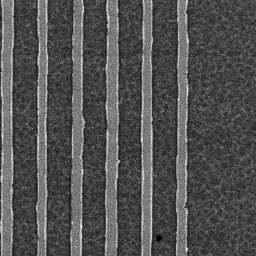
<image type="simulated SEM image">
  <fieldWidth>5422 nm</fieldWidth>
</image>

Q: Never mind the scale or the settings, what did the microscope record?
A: parallel lines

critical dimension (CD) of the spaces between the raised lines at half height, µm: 0.545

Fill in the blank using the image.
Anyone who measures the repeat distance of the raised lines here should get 35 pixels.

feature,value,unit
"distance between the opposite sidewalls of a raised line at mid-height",191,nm